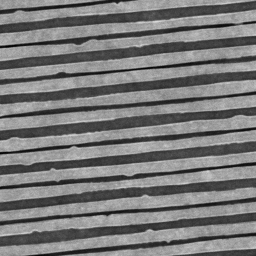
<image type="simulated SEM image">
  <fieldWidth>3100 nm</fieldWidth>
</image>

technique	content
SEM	parallel lines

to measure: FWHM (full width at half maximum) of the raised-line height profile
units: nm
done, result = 119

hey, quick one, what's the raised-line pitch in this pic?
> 213 nanometres